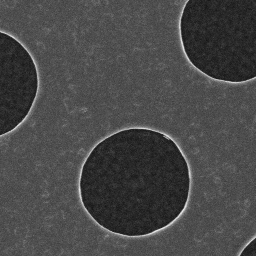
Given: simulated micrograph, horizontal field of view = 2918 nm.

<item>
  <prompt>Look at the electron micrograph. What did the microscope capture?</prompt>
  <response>holes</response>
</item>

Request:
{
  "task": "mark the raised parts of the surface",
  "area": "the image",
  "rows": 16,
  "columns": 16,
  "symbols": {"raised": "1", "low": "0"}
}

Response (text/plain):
1111111111110000
1111111111100000
0111111111100000
0011111111110000
0011111111111000
0011111111111111
0011111111111111
0111111111111111
1111111000111111
1111110000011111
1111100000001111
1111100000001111
1111100000001111
1111110000011111
1111111000111111
1111111111111110